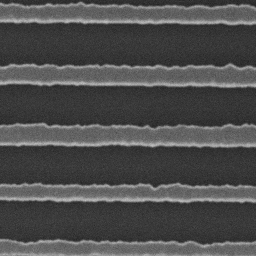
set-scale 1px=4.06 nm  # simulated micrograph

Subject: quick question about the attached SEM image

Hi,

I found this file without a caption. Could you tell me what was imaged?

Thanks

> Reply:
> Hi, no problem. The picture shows lines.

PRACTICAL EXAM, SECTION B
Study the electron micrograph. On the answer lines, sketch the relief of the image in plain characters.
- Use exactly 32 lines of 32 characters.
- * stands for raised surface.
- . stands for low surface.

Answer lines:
..........*.....................
********************************
********************************
................................
................................
................................
................................
................................
********************************
********************************
*...****************************
................................
................................
................................
................................
..*.**..........................
********************************
********************************
................................
................................
................................
................................
................................
********************************
********************************
................................
................................
................................
................................
................................
*************************..*****
********************************